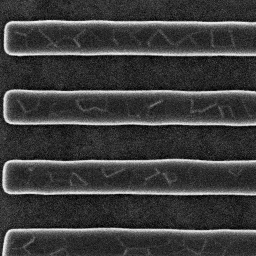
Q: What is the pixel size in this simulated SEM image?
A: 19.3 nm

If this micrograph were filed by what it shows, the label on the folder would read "wiring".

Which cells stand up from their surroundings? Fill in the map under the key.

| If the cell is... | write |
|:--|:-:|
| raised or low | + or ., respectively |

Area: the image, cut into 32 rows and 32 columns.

................................
................................
................................
.+++++++++++++++++++++++++++++++
.+++++++++++++++++++++++++++++++
.+++++++++++++++++++++++++++++++
.+++++++++++++++++++++++++++++++
................................
................................
................................
................................
.+++++++.++++++++++++++....+++++
.+++++++++++++++++++++++++++++++
.+++++++++++++++++++++++++++++++
.+++++++++++++++++++++++++++++++
..........++++++.++++.++++++++++
................................
................................
................................
................................
.+++++++++++++++++++++++++++++++
++++++++++++++++++++++++++++++++
++++++++++++++++++++++++++++++++
++++++++++++++++++++++++++++++++
................................
................................
................................
................................
................................
.+++++++++++++++++++++++++++++++
.+++++++++++++++++++++++++++++++
++++++++++++++++++++++++++++++++